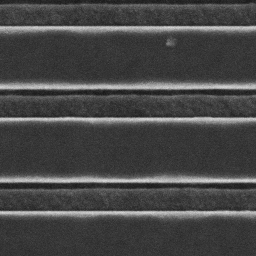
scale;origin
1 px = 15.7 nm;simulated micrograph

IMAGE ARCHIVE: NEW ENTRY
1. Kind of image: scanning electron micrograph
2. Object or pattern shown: lines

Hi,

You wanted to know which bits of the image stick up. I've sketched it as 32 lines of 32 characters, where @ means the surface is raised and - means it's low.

--------------------------------
--------------------------------
--------------------------------
@@@@@@@@@@@@@@@@@@@@@@@@@@@@@@@@
@@@@@@@@@@@@@@@@@@@@@@@@@@@@@@@@
@@@@@@@@@@@@@@@@@@@@@@@@@@@@@@@@
@@@@@@@@@@@@@@@@@@@@@@@@@@@@@@@@
@@@@@@@@@@@@@@@@@@@@@@@@@@@@@@@@
@@@@@@@@@@@@@@@@@@@@@@@@@@@@@@@@
@@@@@@@@@@@@@@@@@@@@@@@@@@@@@@@@
@@@@@@@@@@@@@@@@@@@@@@@@@@@@@@@@
--------------------------------
--------------------------------
--------------------------------
--------------------------------
@@@@@@@@@@@@@@@@@@@@@@@@@@@@@@@@
@@@@@@@@@@@@@@@@@@@@@@@@@@@@@@@@
@@@@@@@@@@@@@@@@@@@@@@@@@@@@@@@@
@@@@@@@@@@@@@@@@@@@@@@@@@@@@@@@@
@@@@@@@@@@@@@@@@@@@@@@@@@@@@@@@@
@@@@@@@@@@@@@@@@@@@@@@@@@@@@@@@@
@@@@@@@@@@@@@@@@@@@@@@@@@@@@@@@@
@@@@@@@@@@@@@@@@@@@@@@@@@@@@@@@@
--------------------------------
--------------------------------
--------------------------------
---@@@@@@---@@@----------@@@@@@-
@@@@@@@@@@@@@@@@@@@@@@@@@@@@@@@@
@@@@@@@@@@@@@@@@@@@@@@@@@@@@@@@@
@@@@@@@@@@@@@@@@@@@@@@@@@@@@@@@@
@@@@@@@@@@@@@@@@@@@@@@@@@@@@@@@@
@@@@@@@@@@@@@@@@@@@@@@@@@@@@@@@@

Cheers